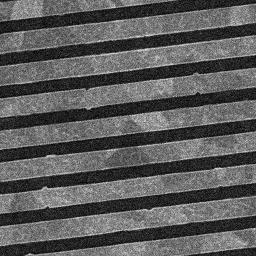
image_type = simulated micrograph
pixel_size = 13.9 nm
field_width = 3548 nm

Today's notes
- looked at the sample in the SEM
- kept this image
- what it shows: parallel lines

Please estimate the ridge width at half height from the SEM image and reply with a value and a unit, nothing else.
251 nm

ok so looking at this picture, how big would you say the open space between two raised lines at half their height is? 184 nm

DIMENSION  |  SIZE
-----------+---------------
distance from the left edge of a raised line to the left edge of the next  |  440 nanometers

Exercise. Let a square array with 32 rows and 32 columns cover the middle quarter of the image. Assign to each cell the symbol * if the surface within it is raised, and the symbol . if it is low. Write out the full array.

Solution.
************************........
****************................
********........................
.............................***
.....................***********
............********************
..***.**************************
********************************
************************........
***************.................
*********.......................
............................****
....................************
...........*********************
...*****************************
********************************
*************************.......
***************.................
******..........................
.............................***
.....................***********
............********************
..******************************
********************************
************************........
***************.................
*******.........................
............................****
....................************
............********************
...*****************************
********************************